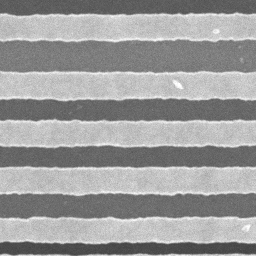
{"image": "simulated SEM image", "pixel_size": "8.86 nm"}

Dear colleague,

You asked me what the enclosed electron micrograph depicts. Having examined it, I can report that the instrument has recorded lines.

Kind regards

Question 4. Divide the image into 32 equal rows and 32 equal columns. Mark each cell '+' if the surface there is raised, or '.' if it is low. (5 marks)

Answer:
................................
................................
++++++++++++++++++++++++++++++++
++++++++++++++++++++++++++++++++
++++++++++++++++++++++++++++++++
................................
................................
................................
................................
++++++++++++++++++++++++++++++++
++++++++++++++++++++++++++++++++
++++++++++++++++++++++++++++++++
.......+++....+.........+.....++
................................
................................
++++++++++++++++++++++++++++++++
++++++++++++++++++++++++++++++++
++++++++++++++++++++++++++++++++
................................
................................
................................
++++++++++++++++++++++++++++++++
++++++++++++++++++++++++++++++++
++++++++++++++++++++++++++++++++
................................
................................
................................
++++++++++++++++++++++++++++++++
++++++++++++++++++++++++++++++++
++++++++++++++++++++++++++++++++
...........++...................
................................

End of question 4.